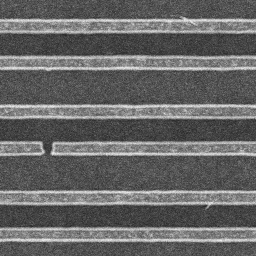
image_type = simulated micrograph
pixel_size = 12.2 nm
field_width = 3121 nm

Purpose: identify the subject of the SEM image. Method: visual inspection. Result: parallel lines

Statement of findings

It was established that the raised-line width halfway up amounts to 154 nm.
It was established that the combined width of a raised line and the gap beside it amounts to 508 nm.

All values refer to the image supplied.